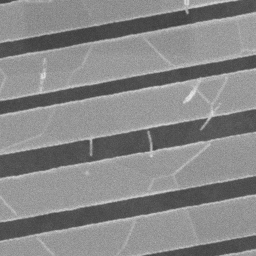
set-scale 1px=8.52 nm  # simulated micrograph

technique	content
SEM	lines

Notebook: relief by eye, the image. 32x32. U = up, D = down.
DUUUUUUUUUUUUUUUUUUUUUUUUUUDDDDD
UUUUUUUUUUUUUUUUUUUUUUDDDDDDDDDD
UUUUUUUUUUUUUUUUDDDDDDDDDDUUUUUU
UUUUUUUUUUDDDDDDDDDDDUUUUUUUUUUU
UUUUUDDDDDDDDDDDUUUUUUUUUUUUUUUU
DDDDDDDDDDUUUUUUUUUUUUUUUUUUUUUU
DDDDDUUUUUUUUUUUUUUUUUUUUUUUUUUU
UUUUUUUUUUUUUUUUUUUUUUUUUUUUDDDD
UUUUUUUUUUUUUUUUUUUUUUUDDDDDDDDD
UUUUUUUUUUUUUUUUUDDDDDDDDDDUUUUU
UUUUUUUUUUUUDDDDDDDDDUUUUUUUUUUU
UUUUUUDDDDDDDDDDUUUUUUUUUUUUUUUU
DDDDDDDDDDUUUUUUUUUUUUUUUUUUUUUU
DDDDDUUUUUUUUUUUUUUUUUUUUUUUUUUU
UUUUUUUUUUUUUUUUUUUUUUUUUUUDDDDD
UUUUUUUUUUUUUUUUUUUUUDDDDDDDDDDD
UUUUUUUUUUUUUUUUDDDDDDDDDDDDDDDD
UUUUUUUUUUUDDDDDDDDDDDDDDDDUUUUU
UUUUUDDDDDDDDDDDDDDDDUUUUUUUUUUU
DDDDDDDDDDDDDDDDUUUUUUUUUUUUUUUU
DDDDDDDDDDUUUUUUUUUUUUUUUUUUUUUU
DDDDDUUUUUUUUUUUUUUUUUUUUUUUUUUU
UUUUUUUUUUUUUUUUUUUUUUUUUUUUUDDD
UUUUUUUUUUUUUUUUUUUUUUUDDDDDDDDD
UUUUUUUUUUUUUUUUUUDDDDDDDDDDDDDU
UUUUUUUUUUUUUDDDDDDDDDDDDDUUUUUU
UUUUUUUDDDDDDDDDDDDDUUUUUUUUUUUU
UUDDDDDDDDDDDDDUUUUUUUUUUUUUUUUU
DDDDDDDDDUUUUUUUUUUUUUUUUUUUUUUU
DDDDUUUUUUUUUUUUUUUUUUUUUUUUUUUD
UUUUUUUUUUUUUUUUUUUUUUUUUUDDDDDD
UUUUUUUUUUUUUUUUUUUUDDDDDDDDDDUU